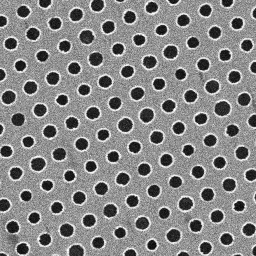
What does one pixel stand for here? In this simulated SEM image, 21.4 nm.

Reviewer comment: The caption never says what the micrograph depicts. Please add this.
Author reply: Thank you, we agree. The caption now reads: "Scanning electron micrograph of a regular array of holes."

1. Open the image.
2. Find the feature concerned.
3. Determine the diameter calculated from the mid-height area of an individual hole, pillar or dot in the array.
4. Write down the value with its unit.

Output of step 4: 0.273 um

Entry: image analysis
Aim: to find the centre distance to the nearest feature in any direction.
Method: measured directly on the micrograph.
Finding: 504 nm